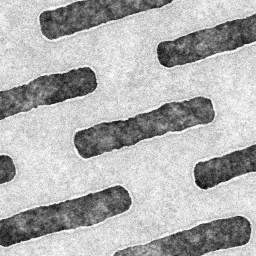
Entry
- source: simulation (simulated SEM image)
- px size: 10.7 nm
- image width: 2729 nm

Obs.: holes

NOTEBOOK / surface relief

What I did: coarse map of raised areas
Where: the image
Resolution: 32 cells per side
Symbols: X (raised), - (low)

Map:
XXXXXXXXX------------XXXXXXXXXXX
XXXXX-------------XXXXXXXXXXXXXX
XXXXX----------XXXXXXXXXXXXXX---
XXXXX-------XXXXXXXXXXXXXX------
XXXXXX---XXXXXXXXXXXXXX---------
XXXXXXXXXXXXXXXXXXXX-----------X
XXXXXXXXXXXXXXXXXXXX--------XXXX
XXXXXXXXXXXXXXXXXXXX-----XXXXXXX
XXXXXXXXXX-XXXXXXXXXXXXXXXXXXXXX
XXXXX-------XXXXXXXXXXXXXXXXXXXX
XXX---------XXXXXXXXXXXXXXXXXXXX
------------XXXXXXXXXXXXXXXXXXXX
---------XXXXXXXXXXXXXX---XXXXXX
----XXXXXXXXXXXXXXXX-------XXXXX
-XXXXXXXXXXXXXXXX----------XXXXX
XXXXXXXXXXXX--------------XXXXXX
XXXXXXXXXX-------------XXXXXXXXX
XXXXXXXXX---------XXXXXXXXXXXXXX
XXXXXXXXX------XXXXXXXXXXXXXXX--
-XXXXXXXXX--XXXXXXXXXXXXXXXX----
--XXXXXXXXXXXXXXXXXXXXXXX-------
--XXXXXXXXXXXXXXXXXXXXXX--------
-XXXXXXXXXXXXXXXXXXXXXXX-----XXX
XXXXXXXXXXXXX--XXXXXXXXXX-XXXXXX
XXXXXXXXXX------XXXXXXXXXXXXXXXX
XXXXXXX---------XXXXXXXXXXXXXXXX
XXX-------------XXXXXXXXXXXXXXXX
-------------XXXXXXXXXXXXXX----X
----------XXXXXXXXXXXXXX-------X
-----XXXXXXXXXXXXXXX-----------X
--XXXXXXXXXXXXXXXX-------------X
XXXXXXXXXXXXXX------------XXXXXX